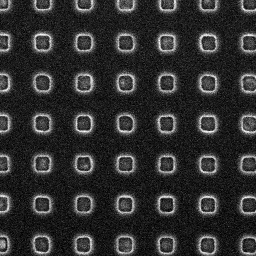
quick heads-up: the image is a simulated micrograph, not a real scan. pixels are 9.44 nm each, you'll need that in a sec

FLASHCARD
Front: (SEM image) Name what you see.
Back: a regular array of holes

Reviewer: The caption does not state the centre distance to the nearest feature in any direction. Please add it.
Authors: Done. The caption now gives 381 nm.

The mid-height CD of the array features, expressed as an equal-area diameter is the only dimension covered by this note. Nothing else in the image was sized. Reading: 150 nanometers